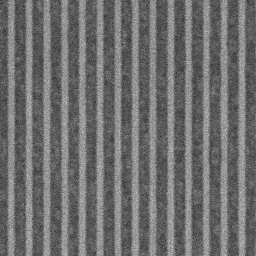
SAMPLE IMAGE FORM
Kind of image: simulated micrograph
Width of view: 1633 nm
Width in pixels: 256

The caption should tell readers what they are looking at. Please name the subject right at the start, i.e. parallel lines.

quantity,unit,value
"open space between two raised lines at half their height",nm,75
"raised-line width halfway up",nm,37.5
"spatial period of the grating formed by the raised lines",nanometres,113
